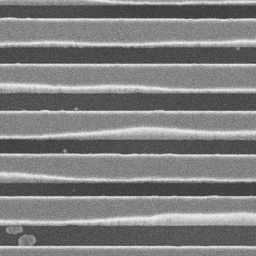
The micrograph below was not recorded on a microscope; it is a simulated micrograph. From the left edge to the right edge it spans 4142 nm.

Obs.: lines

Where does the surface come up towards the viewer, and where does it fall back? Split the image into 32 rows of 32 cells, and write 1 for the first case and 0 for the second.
00000000000000000000000000000000
00000000000000000000000000000000
11111111111111111111111111111111
11111111111111111111111111111111
11111111111111111111111111111111
11111111111111111111111111111000
00000000000000000000000000000000
00000000000000000000000000000000
11111111111111111111111111111111
11111111111111111111111111111111
11111111111111111111111111111111
00000000000000000000000000000000
00000000000000000000000000000000
00000000000000000000000000000000
11111111111111111111111111111111
11111111111111111111111111111111
11111111111111111111111111111111
00000000000000000000000000000000
00000000000000000000000000000000
11111111111111111111111111111111
11111111111111111111111111111111
11111111111111111111111111111111
00000001111111111111111111111111
00000000000000000000000000000000
00000000000010000001010000110001
11111111111111111111111111111111
11111111111111111111111111111111
11111111111111111111111111000000
00000000000000000000000000000000
00000000000000000000000000000000
00000000000000000000000000000000
11111111111111111111111111111111